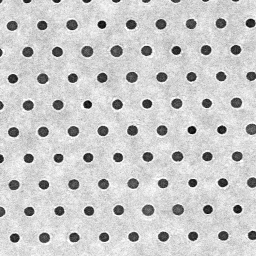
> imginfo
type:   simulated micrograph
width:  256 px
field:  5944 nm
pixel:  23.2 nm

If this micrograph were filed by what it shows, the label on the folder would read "a regular array of holes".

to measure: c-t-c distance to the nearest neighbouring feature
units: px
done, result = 29.7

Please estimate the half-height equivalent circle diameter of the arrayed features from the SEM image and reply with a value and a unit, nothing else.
0.248 micrometres